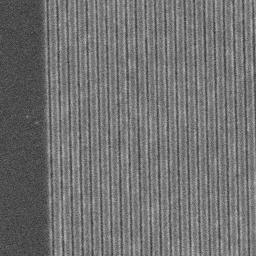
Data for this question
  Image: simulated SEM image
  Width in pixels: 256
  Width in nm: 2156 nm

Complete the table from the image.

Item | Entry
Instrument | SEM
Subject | parallel lines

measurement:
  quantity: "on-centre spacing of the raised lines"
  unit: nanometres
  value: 82.4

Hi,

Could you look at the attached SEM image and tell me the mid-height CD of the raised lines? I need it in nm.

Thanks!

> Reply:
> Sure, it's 60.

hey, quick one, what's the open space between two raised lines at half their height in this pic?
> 24.2 nanometers